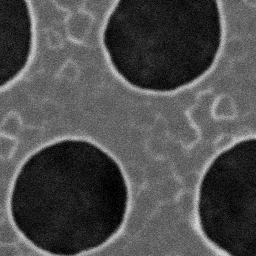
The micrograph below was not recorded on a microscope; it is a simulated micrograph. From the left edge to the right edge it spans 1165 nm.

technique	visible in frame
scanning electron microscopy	holes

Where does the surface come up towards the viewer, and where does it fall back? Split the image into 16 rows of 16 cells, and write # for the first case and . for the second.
..#####.......##
..#####.......##
..####........##
..#####......###
.######......###
#########..#####
################
################
################
##.....#######..
#......######...
#.......#####...
#.......####....
#.......####....
#......######...
##....########..